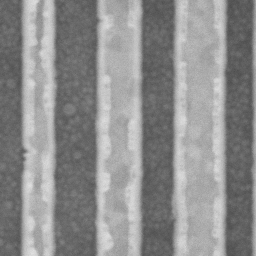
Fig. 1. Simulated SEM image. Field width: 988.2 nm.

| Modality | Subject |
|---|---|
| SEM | one or a few lines or trenches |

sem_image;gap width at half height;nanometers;179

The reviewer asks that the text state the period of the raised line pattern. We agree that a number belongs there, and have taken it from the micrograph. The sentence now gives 0.312 microns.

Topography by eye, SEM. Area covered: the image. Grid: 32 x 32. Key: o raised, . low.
...ooo.......oooo.....oooooo....
...ooo.......oooo.....oooooo....
...ooo.......oooo.....oooooo....
...ooo.......oooo.....oooooo....
...ooo.......oooo.....oooooo....
...ooo.......oooo.....oooooo....
...ooo.......oooo.....oooooo....
...ooo.......oooo.....oooooo....
....oo.......oooo.....oooooo....
...ooo.......oooo.....oooooo....
...ooo.......oooo.....oooooo....
...ooo.......oooo.....oooooo....
...ooo.......oooo.....oooooo....
...ooo.......oooo.....oooooo....
...ooo.......oooo.....oooooo....
...ooo.......oooo.....oooooo....
...ooo.......oooo.....oooooo....
...ooo.......oooo.....oooooo....
....oo.......oooo.....oooooo....
....oo.......oooo.....oooooo....
...ooo.......oooo.....oooooo....
...ooo.......oooo.....oooooo....
...ooo.......oooo.....oooooo....
...ooo.......oooo.....oooooo....
...ooo.......oooo.....oooooo....
...ooo.......oooo.....oooooo....
...ooo.......oooo......ooooo....
...ooo.......oooo......ooooo....
...ooo.......oooo......ooooo....
...ooo.......oooo.....oooooo....
...ooo.......oooo.....oooooo....
...ooo.......oooo.....oooooo....